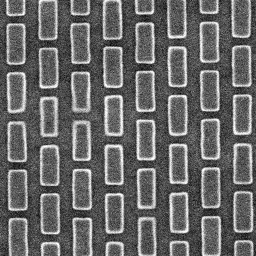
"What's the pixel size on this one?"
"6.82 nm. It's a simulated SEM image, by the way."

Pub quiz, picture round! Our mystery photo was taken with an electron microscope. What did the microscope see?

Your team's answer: groups of lines, slits or small figures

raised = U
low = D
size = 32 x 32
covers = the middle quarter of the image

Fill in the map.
DDDDDDDDDDUUUUDDDDDDDDDDDDUUUUDD
DDDDDDDDDDUUUUDDDDDDDDDDDDUUUUDD
DDUUUUDDDDUUUUDDDDUUUUDDDDUUUUDD
DDUUUUDDDDUUUUDDDDUUUUDDDDUUUUDD
DDUUUUDDDDUUUUDDDDUUUUDDDDUUUUDD
DDUUUUDDDDDUUUDDDDUUUUDDDDDUUUDD
DDUUUUDDDDDDDDDDDDUUUUDDDDDDDDDD
DDUUUUDDDDDDDDDDDDUUUUDDDDDDDDDD
DDDUUUDDDDDUUUDDDDUUUUDDDDUUUUDD
DDDUUUDDDDDUUUDDDDUUUUUDDDUUUUDD
DDDUUUDDDDDUUUDDDDUUUUUDDDUUUUDD
DDDDUUDDDDDUUUDDDDDUUUDDDDUUUUUD
DDDDDDDDDDDUUUDDDDDDDDDDDDUUUUUD
DDDDDDDDDDDUUUDDDDDDDDDDDDUUUUUD
DDDDDDDDDDDUUUDDDDUUUUDDDDUUUUDD
DDDUUUDDDDDUUUDDDDUUUUDDDDUUUUDD
DDDUUUDDDDDUUUDDDDDUUUDDDDUUUUDD
DDDUUUDDDDDUUUDDDDDUUUDDDDDUUUDD
DDDUUUDDDDDDDDDDDDDUUUDDDDDDDDDD
DDDUUUDDDDDDDDDDDDDUUUDDDDDDDDDD
DDDUUUDDDDDUDDDDDDDUUUDDDDDUUUDD
DDDUUUDDDDDUUUDDDDDUUUDDDDDUUUDD
DDDUUUDDDDDUUUDDDDDUUUDDDDDUUUDD
DDDUUUDDDDDUUUDDDDDUUUDDDDDUUUDD
DDDDDDDDDDDUUUDDDDDDDDDDDDDUUUDD
DDDDDDDDDDDUUUDDDDDDDDDDDDDUUUDD
DDDDDDDDDDDUUUUDDDDDUUDDDDDUUUDD
DDUUUUUDDDDUUUUDDDDUUUUDDDDUUUUD
DDUUUUUDDDDUUUUDDDDUUUDDDDDUUUUD
DDUUUUDDDDDUUUUDDDDUUUDDDDDUUUDD
DDUUUUUDDDDDDDDDDDDUUUDDDDDDDDDD
DDUUUUUDDDDDDDDDDDDUUUDDDDDDDDDD